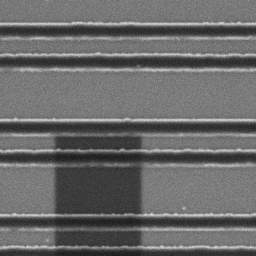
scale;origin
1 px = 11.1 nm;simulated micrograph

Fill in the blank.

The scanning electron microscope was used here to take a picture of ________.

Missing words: lines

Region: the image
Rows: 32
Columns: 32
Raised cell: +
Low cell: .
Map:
................................
................................
................................
++++++++++++++++++++++++++++++++
++++++++++++++++++++++++++++++++
................................
................................
++++++++++++++++++++++++++++++++
++++++++++++++++++++++++++++++++
................................
................................
................................
................................
................................
................................
++++++++++++++++++++++++++++++++
++++++++++++++++++++++++++++++++
................................
................................
++++++++++++++++++++++++++++++++
++++++++++++++++++++++++++++++++
................................
................................
................................
................................
................................
................................
++++++++++++++++++++++++++++++++
++++++++++++++++++++++++++++++++
................................
................................
++++++++++++++++++++++++++++++++